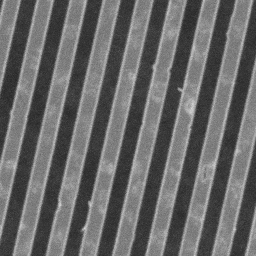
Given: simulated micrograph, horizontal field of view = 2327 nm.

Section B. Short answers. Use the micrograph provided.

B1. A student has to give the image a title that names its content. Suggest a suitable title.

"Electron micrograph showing parallel lines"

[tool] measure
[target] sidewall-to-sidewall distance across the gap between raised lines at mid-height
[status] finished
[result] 0.154 µm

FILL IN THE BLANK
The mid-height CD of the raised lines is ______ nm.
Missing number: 146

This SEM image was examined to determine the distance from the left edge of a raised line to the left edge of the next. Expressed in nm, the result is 295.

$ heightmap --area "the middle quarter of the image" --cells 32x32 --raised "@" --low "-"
@@----@@@@----@@@@@----@@@@----@
@@----@@@@----@@@@-----@@@-----@
@@----@@@@----@@@@-----@@@-----@
@-----@@@@----@@@@----@@@@-----@
@----@@@@-----@@@@----@@@@----@@
@----@@@@----@@@@-----@@@@----@@
@----@@@@----@@@@----@@@@-----@@
-----@@@@----@@@@----@@@@-----@@
----@@@@-----@@@@----@@@@----@@@
----@@@@----@@@@@----@@@@----@@@
----@@@@----@@@@-----@@@@----@@@
----@@@@----@@@@----@@@@-----@@@
----@@@@----@@@@----@@@@-----@@@
---@@@@-----@@@@----@@@@----@@@@
---@@@@----@@@@-----@@@@----@@@@
---@@@@----@@@@-----@@@-----@@@-
---@@@@----@@@@----@@@@-----@@@-
--@@@@-----@@@@----@@@@----@@@@-
--@@@@----@@@@-----@@@@----@@@@-
--@@@@----@@@@-----@@@@----@@@@-
--@@@@----@@@@----@@@@-----@@@@-
--@@@@----@@@@----@@@@-----@@@--
-@@@@-----@@@@----@@@@----@@@@--
-@@@@----@@@@-----@@@@----@@@@--
-@@@@----@@@@-----@@@-----@@@@--
-@@@@----@@@@----@@@@-----@@@---
@@@@-----@@@@----@@@@----@@@@---
@@@@----@@@@-----@@@@----@@@@---
@@@@----@@@@-----@@@@----@@@@---
@@@@----@@@@----@@@@-----@@@@---
@@@@----@@@@----@@@@-----@@@----
@@@-----@@@@----@@@@----@@@@----